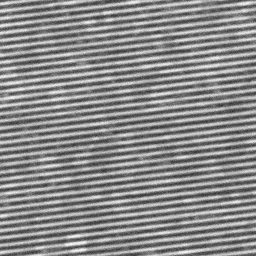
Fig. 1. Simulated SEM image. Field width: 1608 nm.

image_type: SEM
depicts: parallel lines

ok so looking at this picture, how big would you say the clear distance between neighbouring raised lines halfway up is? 4.84 pixels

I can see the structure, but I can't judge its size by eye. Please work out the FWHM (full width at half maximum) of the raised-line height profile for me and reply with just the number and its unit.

14.8 nm